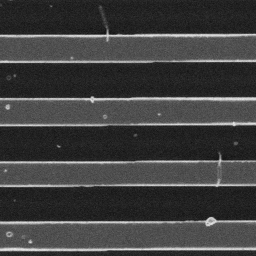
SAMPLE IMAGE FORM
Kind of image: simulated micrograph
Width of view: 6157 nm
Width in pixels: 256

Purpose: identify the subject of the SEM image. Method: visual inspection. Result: lines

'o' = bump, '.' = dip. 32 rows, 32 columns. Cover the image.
................................
................................
................................
................................
oooooooooooooooooooooooooooooooo
oooooooooooooooooooooooooooooooo
oooooooooooooooooooooooooooooooo
oooooooooooooooooooooooooooooooo
................................
................................
................................
................................
oooooooooooooooooooooooooooooooo
oooooooooooooooooooooooooooooooo
oooooooooooooooooooooooooooooooo
ooooooooooooooooooooooooooooooo.
................................
................................
................................
................................
oooooooooooooooooooooooooooooooo
oooooooooooooooooooooooooooooooo
oooooooooooooooooooooooooooooooo
................................
................................
................................
................................
..........................o.....
oooooooooooooooooooooooooooooooo
oooooooooooooooooooooooooooooooo
oooooooooooooooooooooooooooooooo
................................